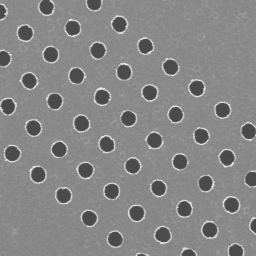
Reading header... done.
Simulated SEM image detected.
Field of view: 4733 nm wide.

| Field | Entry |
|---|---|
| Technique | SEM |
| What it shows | a regular array of holes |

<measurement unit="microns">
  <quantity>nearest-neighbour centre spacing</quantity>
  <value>0.614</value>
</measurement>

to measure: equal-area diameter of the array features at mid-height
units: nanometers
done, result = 270